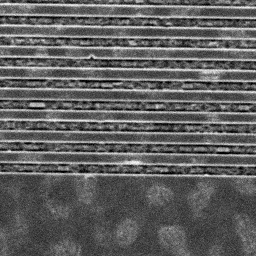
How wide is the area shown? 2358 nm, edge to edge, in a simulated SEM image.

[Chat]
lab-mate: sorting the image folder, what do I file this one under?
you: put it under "parallel lines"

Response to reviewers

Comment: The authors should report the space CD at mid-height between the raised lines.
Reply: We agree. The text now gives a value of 10 px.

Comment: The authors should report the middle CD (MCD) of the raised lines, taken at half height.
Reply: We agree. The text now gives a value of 109 nanometers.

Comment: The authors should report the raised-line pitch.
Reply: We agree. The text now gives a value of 0.194 microns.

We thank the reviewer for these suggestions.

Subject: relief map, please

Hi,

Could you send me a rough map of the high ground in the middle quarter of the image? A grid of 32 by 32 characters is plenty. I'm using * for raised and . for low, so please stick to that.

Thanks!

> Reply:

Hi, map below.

................................
********************************
********************************
********************************
................................
................................
**************..................
********************************
********************************
................................
................................
................................
********************************
********************************
.......................*********
................................
................................
********************************
********************************
********************************
................................
................................
******************************..
********************************
********************************
................................
................................
***********.....................
********************************
********************************
********************************
********************************